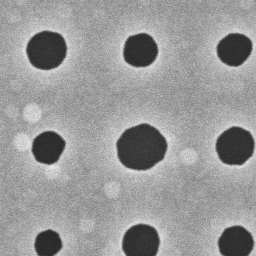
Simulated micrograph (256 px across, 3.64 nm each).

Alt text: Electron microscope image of holes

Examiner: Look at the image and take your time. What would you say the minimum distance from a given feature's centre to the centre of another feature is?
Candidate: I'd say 341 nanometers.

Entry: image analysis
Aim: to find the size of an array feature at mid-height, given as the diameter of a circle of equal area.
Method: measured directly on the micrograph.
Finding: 137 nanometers